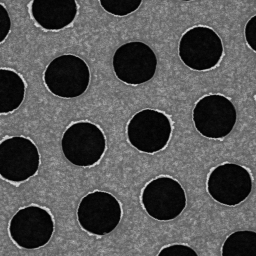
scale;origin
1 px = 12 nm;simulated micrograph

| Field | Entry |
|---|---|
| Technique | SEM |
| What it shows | a regular array of holes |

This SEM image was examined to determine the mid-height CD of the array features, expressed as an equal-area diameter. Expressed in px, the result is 43.1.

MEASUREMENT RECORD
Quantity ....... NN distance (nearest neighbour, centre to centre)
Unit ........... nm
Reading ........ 807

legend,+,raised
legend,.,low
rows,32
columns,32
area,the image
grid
++++.....++++....+++++++++++++++
.+++......++++..++++++++++++++++
.+++.....++++++++++++++++++++++.
.+++++..++++++++++++++++..+++++.
.++++++++++++++++++++++....++++.
++++++++++++++++..++++......+++.
++++++++++++++.....+++......++++
+++++++...++++......+++....+++++
++++++.....+++.....+++++..++++++
..++++.....++++....+++++++++++++
...+++.....+++++++++++++++++++++
...+++....++++++++++++++++++++++
...++++++++++++++++++++++....+++
..++++++++++++++++++++++.....+++
+++++++++++++++++....+++......++
+++++++++..+++++.....+++.....+++
++++++++.....+++.....++++....+++
+...++++.....+++.....+++++++++++
.....+++.....++++...++++++++++++
.....+++.....+++++++++++++++++++
.....++++...++++++++++++++++.+++
....+++++++++++++++++++++++....+
+..++++++++++++++++...++++.....+
++++++++++++++++++.....+++.....+
+++++++++++...++++.....++++....+
++++++++++.....+++.....+++++..++
++....++++.....+++.....+++++++++
+.....++++.....+++++.+++++++++++
+......++++...++++++++++++++++++
+.....+++++++++++++++++++++++...
++....++++++++++++++++++++++....
++++++++++++++++++++....++++....